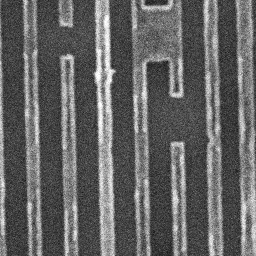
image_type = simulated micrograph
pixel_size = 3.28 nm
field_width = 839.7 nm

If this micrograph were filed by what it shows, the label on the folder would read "parallel lines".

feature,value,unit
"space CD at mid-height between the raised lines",75.8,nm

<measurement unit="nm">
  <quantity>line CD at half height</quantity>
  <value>41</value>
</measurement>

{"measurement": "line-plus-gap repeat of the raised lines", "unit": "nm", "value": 118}